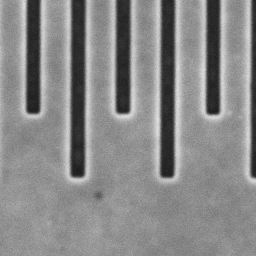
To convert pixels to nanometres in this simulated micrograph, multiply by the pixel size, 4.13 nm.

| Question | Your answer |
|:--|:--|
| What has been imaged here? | parallel lines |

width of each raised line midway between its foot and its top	0.125	microns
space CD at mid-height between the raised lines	60.9	nm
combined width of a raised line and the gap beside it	186	nanometres